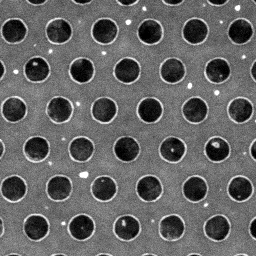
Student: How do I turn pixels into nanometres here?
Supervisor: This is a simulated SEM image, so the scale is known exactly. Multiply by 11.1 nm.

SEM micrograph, a regular array of raised bodies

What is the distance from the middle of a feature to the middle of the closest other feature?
498 nanometres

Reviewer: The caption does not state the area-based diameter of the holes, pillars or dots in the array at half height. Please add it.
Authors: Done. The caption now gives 290 nm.